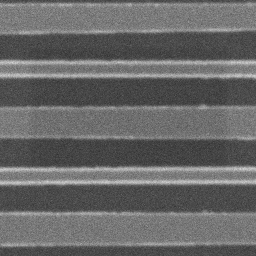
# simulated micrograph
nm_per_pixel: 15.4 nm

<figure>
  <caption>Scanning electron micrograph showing lines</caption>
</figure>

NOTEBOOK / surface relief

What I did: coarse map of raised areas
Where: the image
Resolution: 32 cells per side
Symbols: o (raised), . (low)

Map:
.........................o.....o
oooooooooooooooooooooooooooooooo
oooooooooooooooooooooooooooooooo
oooooooooooooooooooooooooooooooo
................................
................................
................................
................................
oooooooooooooooooooooooooooooooo
oooooooooooooooooooooooooooooooo
................................
................................
................................
....ooooo.oo.ooooooooooooooooooo
oooooooooooooooooooooooooooooooo
oooooooooooooooooooooooooooooooo
oooooooooooooooooooooooooooooooo
................................
................................
................................
................................
oooooooooooooooooooooooooooooooo
oooooooooooooooooooooooooooooooo
................................
................................
................................
................................
oooooooooooooooooooooooooooooooo
oooooooooooooooooooooooooooooooo
oooooooooooooooooooooooooooooooo
oooooooooooooooooooooooo........
................................